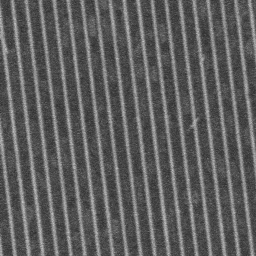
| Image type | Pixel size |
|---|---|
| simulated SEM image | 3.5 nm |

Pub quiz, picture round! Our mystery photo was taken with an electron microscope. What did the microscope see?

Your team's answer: parallel lines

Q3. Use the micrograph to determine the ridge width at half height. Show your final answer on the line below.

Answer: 2.6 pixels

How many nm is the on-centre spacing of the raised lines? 48.5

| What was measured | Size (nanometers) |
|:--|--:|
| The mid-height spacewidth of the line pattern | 39.9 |